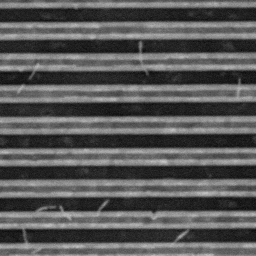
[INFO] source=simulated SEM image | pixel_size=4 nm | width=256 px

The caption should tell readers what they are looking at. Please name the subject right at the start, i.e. parallel lines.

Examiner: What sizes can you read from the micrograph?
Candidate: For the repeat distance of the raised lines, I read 0.126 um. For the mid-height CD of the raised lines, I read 0.0505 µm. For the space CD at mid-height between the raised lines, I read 0.0745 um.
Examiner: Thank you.